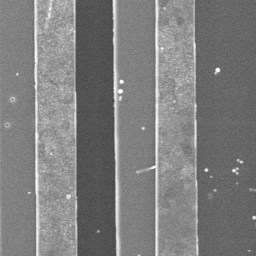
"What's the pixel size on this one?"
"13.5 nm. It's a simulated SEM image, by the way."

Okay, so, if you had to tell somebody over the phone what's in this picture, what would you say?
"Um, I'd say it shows lines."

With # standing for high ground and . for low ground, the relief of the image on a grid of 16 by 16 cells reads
#####..#####....
#####..#####....
#####..#####....
#####..#####....
#####..#####....
#####..#####....
#####..#####....
#####..#####....
#####..#####....
#####..#####....
#####..#####....
#####..#####....
#####..#####....
#####..#####....
#####..#####....
#####..#####....